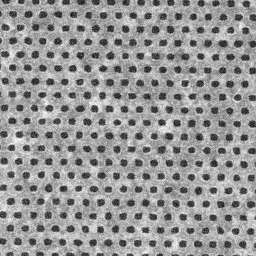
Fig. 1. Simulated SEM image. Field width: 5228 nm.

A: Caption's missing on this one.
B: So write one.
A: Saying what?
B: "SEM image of a regular array of holes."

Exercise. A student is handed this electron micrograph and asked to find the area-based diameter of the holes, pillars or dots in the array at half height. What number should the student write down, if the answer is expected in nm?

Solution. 174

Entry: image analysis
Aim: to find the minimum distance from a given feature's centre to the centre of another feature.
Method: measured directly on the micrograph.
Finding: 303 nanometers